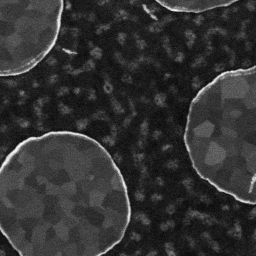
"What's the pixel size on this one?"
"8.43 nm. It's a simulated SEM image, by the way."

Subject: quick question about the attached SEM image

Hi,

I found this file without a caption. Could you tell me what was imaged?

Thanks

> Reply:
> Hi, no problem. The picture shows raised bodies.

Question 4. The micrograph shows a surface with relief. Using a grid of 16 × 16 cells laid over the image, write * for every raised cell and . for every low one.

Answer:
****.......**...
****............
***.............
***.............
**............**
.............***
............****
............****
...**.......****
.******.....****
*******.....****
********.....***
********.......*
********........
********........
.******.........